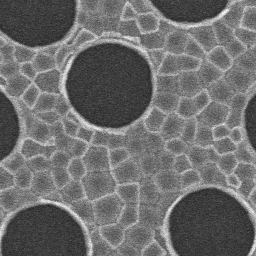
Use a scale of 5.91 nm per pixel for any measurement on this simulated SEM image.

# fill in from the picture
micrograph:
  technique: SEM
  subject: holes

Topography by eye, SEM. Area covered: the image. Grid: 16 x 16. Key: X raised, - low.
-----XXXXX----XX
-----XXXXXXXXXXX
X---XXXXXXXXXXXX
XXXXX----XXXXXXX
XXXX-----XXXXXXX
XXXX------XXXXXX
-XXX-----XXXXXX-
-XXXX---XXXXXXX-
-XXXXXXXXXXXXXX-
-XXXXXXXXXXXXXXX
XXXXXXXXXXXXXXXX
XXXXXXXXXXXXXXXX
XXXXXXXXXXX----X
X---XXXXXXX-----
-----XXXXXX-----
-----XXXXXX-----